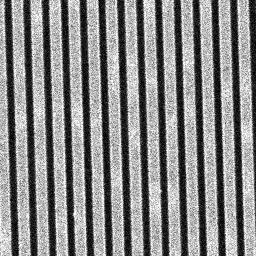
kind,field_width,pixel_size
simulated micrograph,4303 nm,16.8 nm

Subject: parallel lines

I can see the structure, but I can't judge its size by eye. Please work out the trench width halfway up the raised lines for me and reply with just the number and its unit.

105 nm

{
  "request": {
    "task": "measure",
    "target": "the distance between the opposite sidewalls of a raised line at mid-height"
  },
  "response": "210 nm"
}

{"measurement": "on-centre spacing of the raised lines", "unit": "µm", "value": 0.316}